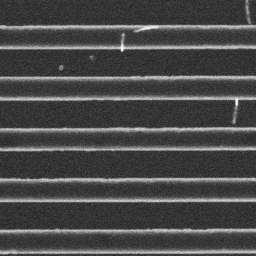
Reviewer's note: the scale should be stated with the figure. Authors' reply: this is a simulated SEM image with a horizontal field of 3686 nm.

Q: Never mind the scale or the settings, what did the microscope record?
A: lines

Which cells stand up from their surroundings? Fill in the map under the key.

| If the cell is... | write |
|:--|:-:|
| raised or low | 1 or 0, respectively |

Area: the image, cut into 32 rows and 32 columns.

00000000000000000000000000000000
00000000000000000000000000000000
00000000000000000000000000000000
11111111111111111111111111111111
11111111111111111111111111111111
11111111111111111111111111111111
00000000000000000000000000000000
00000000000000000000000000000000
00000000000000000000000000000000
00000000000000000000000000000000
11111111111111111111111111111111
11111111111111111111111111111111
00000000000000000000000000000000
00000000000000000000000000000000
00000000000000000000000000000000
00000000000000000000000000000000
11111111111111111111111111111111
11111111111111111111111111111111
11111111111111111111111111111111
00000000000000000000000000000000
00000000000000000000000000000000
00000000000000000000000000000000
11111111111111111111111111111111
11111111111111111111111111111111
11111111111111111111111111111111
00000000000000000000000000000000
00000000000000000000000000000000
00000000000000000000000000000000
00000000000000000000000000000000
11111111111111111111111111111111
11111111111111111111111111111111
11111100000000000000000000000000